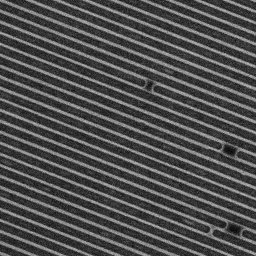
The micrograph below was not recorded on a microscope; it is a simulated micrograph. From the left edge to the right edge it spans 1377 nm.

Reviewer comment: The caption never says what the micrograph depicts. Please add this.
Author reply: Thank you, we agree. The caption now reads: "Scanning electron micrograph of parallel lines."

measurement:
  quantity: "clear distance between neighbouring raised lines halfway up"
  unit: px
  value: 7.34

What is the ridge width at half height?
14.4 nm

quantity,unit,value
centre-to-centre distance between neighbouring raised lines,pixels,10.3